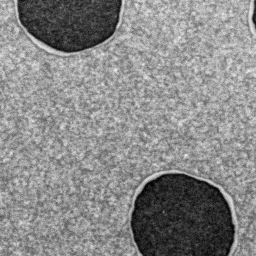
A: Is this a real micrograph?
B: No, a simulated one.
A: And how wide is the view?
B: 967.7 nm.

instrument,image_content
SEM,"holes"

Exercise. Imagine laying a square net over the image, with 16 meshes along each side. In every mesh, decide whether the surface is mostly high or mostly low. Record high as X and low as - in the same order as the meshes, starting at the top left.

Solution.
X-------XXXXXXXX
X------XXXXXXXXX
XX-----XXXXXXXXX
XXXXXXXXXXXXXXXX
XXXXXXXXXXXXXXXX
XXXXXXXXXXXXXXXX
XXXXXXXXXXXXXXXX
XXXXXXXXXXXXXXXX
XXXXXXXXXXXXXXXX
XXXXXXXXXXXXXXXX
XXXXXXXXXXXXXXXX
XXXXXXXXX----XXX
XXXXXXXX------XX
XXXXXXXX-------X
XXXXXXXX-------X
XXXXXXXXX------X